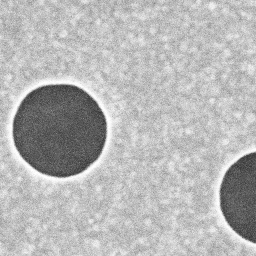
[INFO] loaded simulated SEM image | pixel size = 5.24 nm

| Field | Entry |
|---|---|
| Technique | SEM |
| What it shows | holes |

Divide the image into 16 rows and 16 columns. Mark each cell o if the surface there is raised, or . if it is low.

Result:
oooooooooooooooo
oooooooooooooooo
oooooooooooooooo
oooooooooooooooo
oooooooooooooooo
oo...ooooooooooo
o.....oooooooooo
o......ooooooooo
o......ooooooooo
o.....oooooooooo
oo....oooooooo..
oooooooooooooo..
oooooooooooooo..
oooooooooooooo..
ooooooooooooooo.
oooooooooooooooo